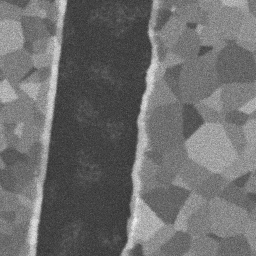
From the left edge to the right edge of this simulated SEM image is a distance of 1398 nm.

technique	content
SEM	one or a few lines or trenches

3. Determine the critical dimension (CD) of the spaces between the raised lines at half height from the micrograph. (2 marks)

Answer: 512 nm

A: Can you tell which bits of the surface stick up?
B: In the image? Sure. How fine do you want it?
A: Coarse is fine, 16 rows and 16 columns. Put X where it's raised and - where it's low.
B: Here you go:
XXXX------XXXXXX
XXXX------XXXXXX
XXXX------XXXXXX
XXXX------XXXXXX
XXX------XXXXXXX
XXX------XXXXXXX
XXX------XXXXXXX
XXX------XXXXXXX
XXX------XXXXXXX
XXX------XXXXXXX
XXX------XXXXXXX
XXX------XXXXXXX
XX------XXXXXXXX
XX------XXXXXXXX
XX------XXXXXXXX
XX------XXXXXXXX